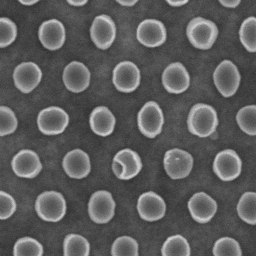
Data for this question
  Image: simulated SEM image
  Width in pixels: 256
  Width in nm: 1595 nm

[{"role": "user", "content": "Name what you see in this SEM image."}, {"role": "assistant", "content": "a regular array of raised bodies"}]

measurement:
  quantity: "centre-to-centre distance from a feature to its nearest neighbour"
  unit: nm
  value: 304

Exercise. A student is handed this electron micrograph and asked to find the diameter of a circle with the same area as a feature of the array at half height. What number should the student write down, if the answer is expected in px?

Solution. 28.4